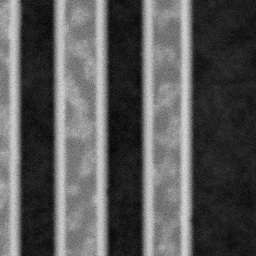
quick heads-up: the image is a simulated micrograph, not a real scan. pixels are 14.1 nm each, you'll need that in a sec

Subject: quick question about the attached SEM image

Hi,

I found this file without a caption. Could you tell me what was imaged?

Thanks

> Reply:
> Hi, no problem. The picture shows one or a few lines or trenches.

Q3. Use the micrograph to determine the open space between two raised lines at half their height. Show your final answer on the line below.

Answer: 688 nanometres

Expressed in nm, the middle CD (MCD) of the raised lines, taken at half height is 529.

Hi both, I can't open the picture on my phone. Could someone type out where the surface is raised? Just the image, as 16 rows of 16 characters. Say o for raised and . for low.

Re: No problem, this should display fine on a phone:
o...oo...oo.....
o...oo...oo.....
o...oo...ooo....
o...oo...ooo....
o...oo...ooo....
o...oo...ooo....
o...oo...ooo....
o...oo...ooo....
o...oo...ooo....
o...oo...ooo....
o...oo...ooo....
o...oo...ooo....
o...oo...ooo....
o...oo...ooo....
o...oo...ooo....
o...oo...ooo....